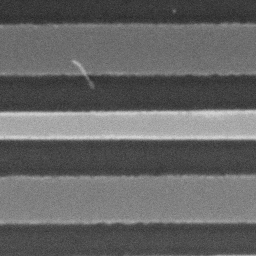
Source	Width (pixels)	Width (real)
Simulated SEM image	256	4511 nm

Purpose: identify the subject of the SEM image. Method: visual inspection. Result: lines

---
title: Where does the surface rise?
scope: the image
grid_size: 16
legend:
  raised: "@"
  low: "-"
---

----------------
----------------
@@@@@@@@@@@@@@@@
@@@@@@@@@@@@@@@@
@@@@@@@@@@@@@@@@
----------------
----------------
@@@@@@@@@@@@@@@@
@@@@@@@@@@@@@@@@
----------------
----------------
@@@@@@@@@@@@@@@@
@@@@@@@@@@@@@@@@
@@@@@@@@@@@@@@@@
----------------
----------------